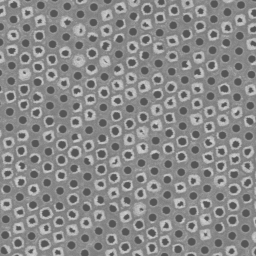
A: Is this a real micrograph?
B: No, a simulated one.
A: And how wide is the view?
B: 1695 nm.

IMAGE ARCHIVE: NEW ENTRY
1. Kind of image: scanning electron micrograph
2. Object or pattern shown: a regular array of holes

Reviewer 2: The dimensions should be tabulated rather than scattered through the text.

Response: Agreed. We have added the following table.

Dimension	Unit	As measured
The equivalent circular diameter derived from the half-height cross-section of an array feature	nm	49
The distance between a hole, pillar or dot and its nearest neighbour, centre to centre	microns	0.0991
